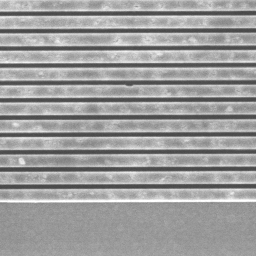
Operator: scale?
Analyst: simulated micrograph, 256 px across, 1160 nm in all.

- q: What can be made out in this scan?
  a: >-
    parallel lines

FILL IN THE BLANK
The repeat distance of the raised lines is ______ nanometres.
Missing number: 78.4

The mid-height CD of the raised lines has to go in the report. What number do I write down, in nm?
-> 56.4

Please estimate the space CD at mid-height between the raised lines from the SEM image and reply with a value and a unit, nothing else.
22.7 nm